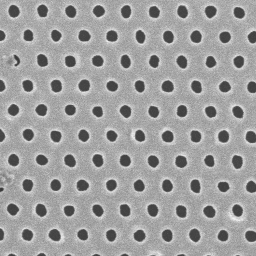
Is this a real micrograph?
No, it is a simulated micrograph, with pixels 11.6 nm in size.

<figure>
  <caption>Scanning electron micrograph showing a regular array of holes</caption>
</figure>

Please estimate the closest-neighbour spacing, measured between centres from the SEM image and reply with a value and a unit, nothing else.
0.32 um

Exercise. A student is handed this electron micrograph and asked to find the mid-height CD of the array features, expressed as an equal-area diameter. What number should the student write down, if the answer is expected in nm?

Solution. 138